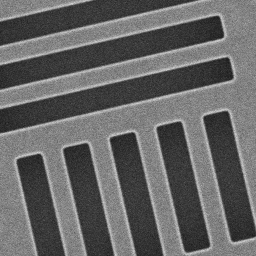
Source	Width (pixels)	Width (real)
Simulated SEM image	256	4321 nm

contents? groups of lines, slits or small figures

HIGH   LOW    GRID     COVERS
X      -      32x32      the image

XXXXXXXXX--------------XXXXXXXXX
XXXXX--------------XXXXXXXXXXXXX
--------------XXXXXXXXXX----XXXX
----------XXXXXXXXXX--------XXXX
------XXXXXXXXXX------------XXXX
-XXXXXXXXXX--------------XXXXXXX
XXXXXXX--------------XXXXXXXXXXX
XX--------------XXXXXXXXXX---XXX
------------XXXXXXXXXX-------XXX
--------XXXXXXXXXX-----------XXX
---XXXXXXXXXX--------------XXXXX
XXXXXXXXX--------------XXXXXXXXX
XXXXX-------------XXXXXXXXXXXXXX
--------------XXXXXXXXXXXXXXXXXX
----------XXXXXXXXXXXXXXXX---XXX
-----XXXXXXXXXXXXXXXX--XXX---XXX
-XXXXXXXXXXXXXXXXXXX---XXX---XXX
XXXXXXXXXXXXXX---XXX---XXX---XXX
XXXXXXXX---XXX---XXX----XX----XX
XXX--XXX---XXX----XX----XX----XX
XX----XX----XX----XXX---XXX---XX
XX----XX----XXX---XXX---XXX---XX
XXX---XXX---XXX---XXX---XXX----X
XXX---XXX---XXX----XX----XX----X
XXX---XXX----XX----XX----XXX---X
XXX----XX----XXX---XXX---XXX---X
XXX----XXX---XXX---XXX---XXX---X
XXXX---XXX---XXX---XXX----XX----
XXXX---XXX----XX----XX----XXX---
XXXX----XX----XX----XXX---XXX---
XXXX----XXX---XXX---XXX---XXXXXX
XXXXX---XXX---XXX---XXX-XXXXXXXX